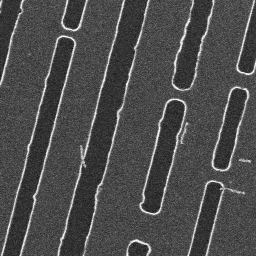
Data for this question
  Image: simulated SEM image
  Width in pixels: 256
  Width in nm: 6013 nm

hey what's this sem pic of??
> one or a few lines or trenches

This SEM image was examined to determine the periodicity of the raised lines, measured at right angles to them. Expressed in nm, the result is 1450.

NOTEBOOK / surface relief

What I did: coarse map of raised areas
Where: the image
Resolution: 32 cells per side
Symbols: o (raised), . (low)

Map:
...ooooo...oooo...oooooo...ooooo
...ooooo..ooooo...oooooo..ooooo.
..oooooo..ooooo...oooooo..ooooo.
..oooooo..ooooo...ooooo...ooooo.
.ooooooooooooo...oooooo..oooooo.
.oooooo..ooooo...oooooo..ooooo..
.oooooo..ooooo...ooooo...ooooo..
.oooooo..ooooo...ooooo...ooooo..
.ooooo...oooo...oooooo...ooooo..
oooooo..ooooo...oooooo..oooooooo
oooooo..ooooo...oooooo..oooooooo
ooooo...ooooo...ooooooooooooo..o
ooooo...oooo...oooooooooooooo..o
ooooo..ooooo...oooooo..ooooo...o
ooooo..ooooo...ooooo...ooooo..oo
oooo...ooooo...ooooo...ooooo..oo
oooo...oooo...oooooo..oooooo..oo
oooo..ooooo...oooooo..ooooo..ooo
oooo..ooooo...ooooo...ooooo..ooo
ooo...ooooo...ooooo...ooooo..ooo
ooo...oooo...oooooo..oooooo..ooo
ooo..ooooo...oooooo..ooooooooooo
ooo..ooooo...ooooo...ooooooooooo
oo...oooo...oooooo...ooooo..oooo
oo..ooooo...oooooo..ooooo...oooo
oo..ooooo...oooooo..ooooo..ooooo
oo..ooooo...oooooo..ooooo..ooooo
o...oooo....ooooooooooooo..ooooo
o..ooooo...ooooooooooooo...ooooo
o..ooooo...ooooooooooooo..oooooo
o..ooooo...ooooo..oooooo..oooooo
...oooo....ooooo...ooooo..oooooo